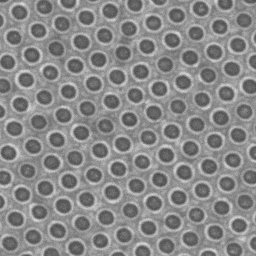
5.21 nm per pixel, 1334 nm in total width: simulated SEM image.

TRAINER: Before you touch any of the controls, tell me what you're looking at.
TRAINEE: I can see a regular array of holes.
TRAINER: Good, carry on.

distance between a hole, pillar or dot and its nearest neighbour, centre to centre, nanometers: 127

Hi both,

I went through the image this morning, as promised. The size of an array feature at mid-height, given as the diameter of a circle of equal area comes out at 16.2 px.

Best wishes